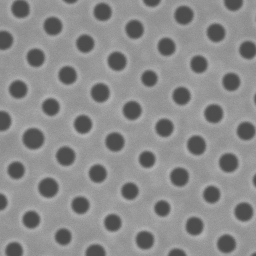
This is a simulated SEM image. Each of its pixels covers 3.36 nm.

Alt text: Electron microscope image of a regular array of holes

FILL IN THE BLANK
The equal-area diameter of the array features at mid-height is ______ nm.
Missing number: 61.5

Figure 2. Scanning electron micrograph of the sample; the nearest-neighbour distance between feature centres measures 121 nanometres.